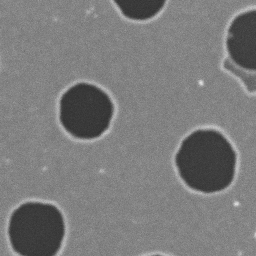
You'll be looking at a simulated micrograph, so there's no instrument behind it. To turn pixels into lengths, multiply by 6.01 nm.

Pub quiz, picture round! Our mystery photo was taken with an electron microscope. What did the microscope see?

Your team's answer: holes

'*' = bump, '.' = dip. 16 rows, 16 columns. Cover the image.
*******...******
**************..
**************..
**************..
****************
****..**********
****...*********
****...*********
*****.******..**
***********....*
***********....*
************..**
****************
*...************
*...************
*...************